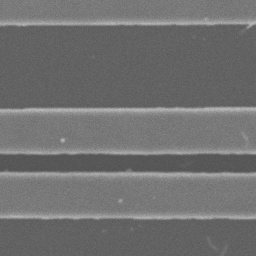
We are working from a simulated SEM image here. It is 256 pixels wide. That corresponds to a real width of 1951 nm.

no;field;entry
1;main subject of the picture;lines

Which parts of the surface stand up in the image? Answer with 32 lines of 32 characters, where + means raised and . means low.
++++++++++++++++++++++++++++++++
++++++++++++++++++++++++++++++++
++++++++++++++++++++++++++++++++
................................
................................
................................
................................
................................
................................
................................
................................
................................
................................
...................+.....+++++++
++++++++++++++++++++++++++++++++
++++++++++++++++++++++++++++++++
++++++++++++++++++++++++++++++++
++++++++++++++++++++++++++++++++
++++++++++++++++++++++++++++++++
................................
................................
................................
++++++++++++++++++++++++++++++++
++++++++++++++++++++++++++++++++
++++++++++++++++++++++++++++++++
++++++++++++++++++++++++++++++++
++++++++++++++++++++++++++++++++
................................
................................
................................
................................
................................